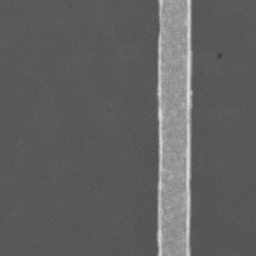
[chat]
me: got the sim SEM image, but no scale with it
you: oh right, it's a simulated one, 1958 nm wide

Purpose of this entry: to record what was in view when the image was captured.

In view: one or a few lines or trenches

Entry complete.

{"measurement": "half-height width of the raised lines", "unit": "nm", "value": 215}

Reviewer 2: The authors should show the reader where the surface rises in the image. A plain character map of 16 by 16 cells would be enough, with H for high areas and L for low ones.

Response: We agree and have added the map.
LLLLLLLLLLHHLLLL
LLLLLLLLLLHHLLLL
LLLLLLLLLLHHLLLL
LLLLLLLLLLHHLLLL
LLLLLLLLLLHHLLLL
LLLLLLLLLLHHLLLL
LLLLLLLLLLHHLLLL
LLLLLLLLLLHHLLLL
LLLLLLLLLLHHLLLL
LLLLLLLLLLHHLLLL
LLLLLLLLLLHHLLLL
LLLLLLLLLLHHLLLL
LLLLLLLLLLHHLLLL
LLLLLLLLLLHHLLLL
LLLLLLLLLLHHLLLL
LLLLLLLLLLHHLLLL